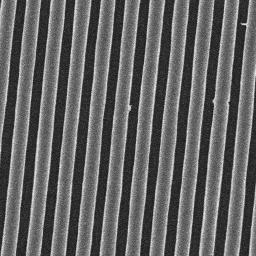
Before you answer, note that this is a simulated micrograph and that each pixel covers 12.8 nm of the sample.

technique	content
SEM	parallel lines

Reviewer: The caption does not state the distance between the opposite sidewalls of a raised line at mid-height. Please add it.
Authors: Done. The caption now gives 178 nm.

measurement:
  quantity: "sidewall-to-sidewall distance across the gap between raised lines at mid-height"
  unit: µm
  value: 0.131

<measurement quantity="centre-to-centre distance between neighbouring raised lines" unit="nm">315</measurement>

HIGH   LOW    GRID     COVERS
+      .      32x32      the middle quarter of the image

..+++...+++...+++...+++...++++..
.++++...+++...+++...+++...++++..
.++++..++++...+++...+++...++++..
.++++...+++...+++...+++...+++...
.++++..++++...+++...+++...+++...
.+++...++++..++++..++++...+++...
.+++...++++..++++..++++...+++...
.+++...+++...++++..++++...+++...
.+++...+++...+++...++++..++++...
.+++...+++...+++...++++..++++...
.+++...+++...+++...+++...++++..+
.+++...+++...++++..+++...+++...+
++++..++++...+++...+++...+++...+
++++..++++..++++...+++...+++...+
++++..++++..++++...+++...+++...+
+++...+++...++++..++++...+++...+
+++...+++...++++..++++...+++...+
+++...+++...++++..++++...+++...+
+++...+++...+++...++++..++++...+
+++...+++...+++...++++..++++...+
+++...+++...+++...+++...++++..++
+++...+++...+++...+++...++++..++
+++...+++...+++...+++...++++..++
+++...+++...+++...+++...+++...++
+++..++++...+++...+++...+++...++
++...++++..++++..++++...+++...++
++...++++..++++..++++...+++...++
++...++++..++++..++++...+++...++
++...+++...+++...++++..++++...++
++...+++...+++...++++..++++...++
++...+++...+++...++++..++++...++
++...+++...+++...+++...+++...+++